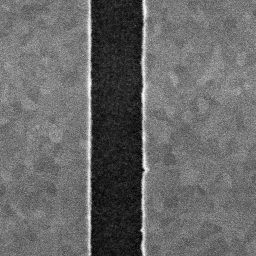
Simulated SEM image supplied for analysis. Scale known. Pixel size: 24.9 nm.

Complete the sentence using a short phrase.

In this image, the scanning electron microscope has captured one or a few lines or trenches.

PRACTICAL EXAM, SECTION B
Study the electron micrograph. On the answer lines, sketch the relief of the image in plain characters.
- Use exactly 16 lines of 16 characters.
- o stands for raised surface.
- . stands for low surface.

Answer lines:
oooooo...ooooooo
oooooo...ooooooo
oooooo...ooooooo
oooooo...ooooooo
oooooo...ooooooo
oooooo...ooooooo
oooooo...ooooooo
oooooo...ooooooo
oooooo...ooooooo
oooooo...ooooooo
oooooo...ooooooo
oooooo...ooooooo
oooooo...ooooooo
oooooo...ooooooo
oooooo...ooooooo
oooooo...ooooooo